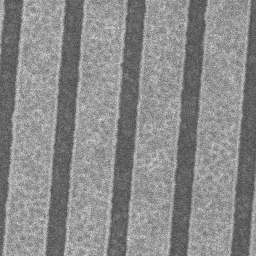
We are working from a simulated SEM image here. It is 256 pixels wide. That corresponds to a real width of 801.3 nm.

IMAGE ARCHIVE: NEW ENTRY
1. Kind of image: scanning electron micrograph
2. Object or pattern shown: parallel lines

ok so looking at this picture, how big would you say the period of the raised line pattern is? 192 nanometers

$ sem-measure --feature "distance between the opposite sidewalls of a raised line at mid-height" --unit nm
128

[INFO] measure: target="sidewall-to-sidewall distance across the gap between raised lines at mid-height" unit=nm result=63.6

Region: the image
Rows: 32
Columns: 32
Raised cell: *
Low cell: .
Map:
...*****...*****..******..*****.
...*****...*****..*****...*****.
...*****..******..*****...*****.
...*****..*****...*****...*****.
...*****..*****...*****...*****.
...*****..*****...*****...*****.
...*****..*****...*****...*****.
..******..*****...*****..******.
..*****...*****...*****..******.
..*****...*****...*****..******.
..*****...*****...*****..*****..
..*****...*****..******..*****..
..*****...*****..******..*****..
..*****...*****..******..*****..
..*****...*****..*****...*****..
..*****...*****..*****...*****..
..*****..*****...*****...*****..
..*****..*****...*****...*****..
..*****..*****...*****...*****..
..****...*****...*****...*****..
.*****...*****...*****..******..
.*****...*****...*****..******..
.*****...*****...*****..*****...
.*****...*****...*****..*****...
.*****...*****..******..*****...
.*****...*****..*****...*****...
.*****...*****..*****...*****...
.*****..******..*****...*****...
.*****..******..*****...*****...
.*****..******..*****...*****..*
.*****..*****...*****...*****..*
******..*****...*****...*****..*